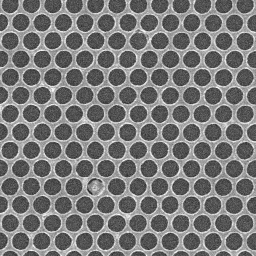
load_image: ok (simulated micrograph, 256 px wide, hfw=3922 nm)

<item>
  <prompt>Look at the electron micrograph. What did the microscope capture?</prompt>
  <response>a regular array of holes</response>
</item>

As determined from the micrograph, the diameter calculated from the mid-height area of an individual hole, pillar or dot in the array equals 269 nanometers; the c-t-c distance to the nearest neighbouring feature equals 0.32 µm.